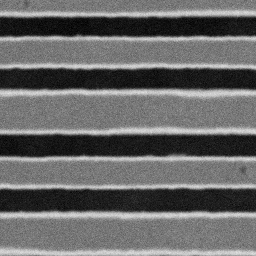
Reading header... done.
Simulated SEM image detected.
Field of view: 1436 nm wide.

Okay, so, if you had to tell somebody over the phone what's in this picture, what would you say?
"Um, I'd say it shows lines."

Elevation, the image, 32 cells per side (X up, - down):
XXXXXXXXXXXXXXXXXXXXXXXXXXXXXXXX
XXXXXXXXXXXXXXXXXXXXXXXXXXXXXXXX
--------------------------------
--------------------------------
--------------------------------
XXXXXXXXXXXXXXXXXXXXXXXXXXXXXXXX
XXXXXXXXXXXXXXXXXXXXXXXXXXXXXXXX
XXXXXXXXXXXXXXXXXXXXXXXXXXXXXXXX
XXXXX-X-XXXXXXXXXX---XX---XXXXXX
--------------------------------
--------------------------------
XXXXXXXXXXXXXXXXXXXXXXXXXXXXXXXX
XXXXXXXXXXXXXXXXXXXXXXXXXXXXXXXX
XXXXXXXXXXXXXXXXXXXXXXXXXXXXXXXX
XXXXXXXXXXXXXXXXXXXXXXXXXXXXXXXX
XXXXXXXXXXXXXXXXXXXXXXXXXXXXXXXX
XXXXXXXXXXXXXXXXXXXXXXXXXXXXXXXX
--------------------------------
--------------------------------
--------------------------------
XXXXXXXXXXXXXXXXXXXXXXXXXXXXXXXX
XXXXXXXXXXXXXXXXXXXXXXXXXXXXXXXX
XXXXXXXXXXXXXXXXXXXXXXXXXXXXXXXX
-XXXX---X-XXXXXX-----X--X-------
--------------------------------
--------------------------------
--------------------------------
XXXXXXXXXXXXXXXXXXXXXXXXXXXXXXXX
XXXXXXXXXXXXXXXXXXXXXXXXXXXXXXXX
XXXXXXXXXXXXXXXXXXXXXXXXXXXXXXXX
XXXXXXXXXXXXXXXXXXXXXXXXXXXXXXXX
XXXXXXXXXXXXXXXXXXXXXXXXXXXXXXXX